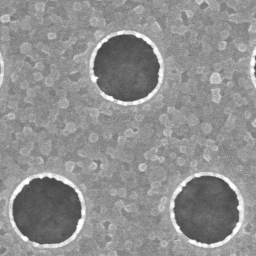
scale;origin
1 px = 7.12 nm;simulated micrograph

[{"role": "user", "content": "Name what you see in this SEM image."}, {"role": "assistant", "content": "holes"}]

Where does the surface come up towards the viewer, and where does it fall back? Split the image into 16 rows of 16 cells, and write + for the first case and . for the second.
++++++++++++++++
++++++++++++++++
+++++++..+++++++
++++++....++++++
++++++....++++++
++++++....++++++
++++++++++++++++
++++++++++++++++
++++++++++++++++
++++++++++++++++
++++++++++++++++
++..++++++++..++
+....++++++....+
+....++++++....+
+....++++++...++
++++++++++++++++